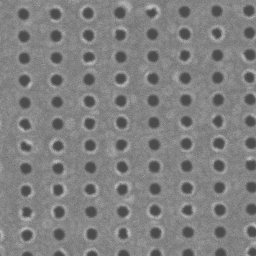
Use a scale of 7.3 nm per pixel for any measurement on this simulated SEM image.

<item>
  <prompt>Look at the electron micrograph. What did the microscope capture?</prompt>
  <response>a regular array of holes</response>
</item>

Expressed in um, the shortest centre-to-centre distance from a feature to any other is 0.16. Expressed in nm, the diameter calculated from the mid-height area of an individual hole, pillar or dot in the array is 82.4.